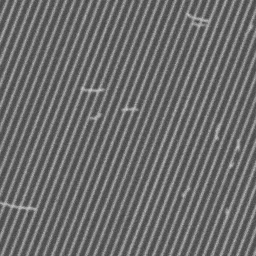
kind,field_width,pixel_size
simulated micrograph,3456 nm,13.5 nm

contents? parallel lines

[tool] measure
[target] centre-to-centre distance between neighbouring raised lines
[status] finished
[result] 106 nm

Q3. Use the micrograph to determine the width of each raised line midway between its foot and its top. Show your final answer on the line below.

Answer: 25.2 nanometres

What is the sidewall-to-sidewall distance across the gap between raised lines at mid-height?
86.7 nanometers